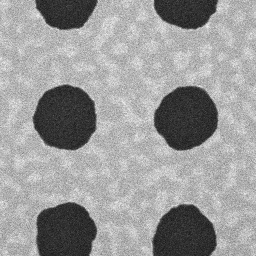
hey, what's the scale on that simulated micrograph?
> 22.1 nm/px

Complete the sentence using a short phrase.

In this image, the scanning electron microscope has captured holes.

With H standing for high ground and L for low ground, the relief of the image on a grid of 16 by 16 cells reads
HHLLLLHHHHLLLLHH
HHHLLHHHHHHLLHHH
HHHHHHHHHHHHHHHH
HHHHHHHHHHHHHHHH
HHHHHHHHHHHHHHHH
HHHLLHHHHHHLLHHH
HHLLLLHHHHLLLHHH
HHLLLLHHHHLLLLHH
HHLLLLHHHHLLLHHH
HHHHHHHHHHHHHHHH
HHHHHHHHHHHHHHHH
HHHHHHHHHHHHHHHH
HHHHHHHHHHHHHHHH
HHLLLLHHHHLLLHHH
HHLLLLHHHHLLLHHH
HHLLLLHHHHLLLHHH